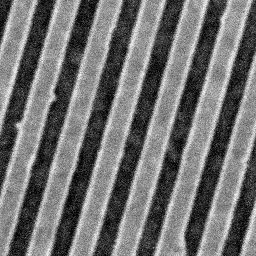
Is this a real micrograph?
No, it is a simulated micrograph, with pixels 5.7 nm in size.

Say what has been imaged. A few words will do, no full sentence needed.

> parallel lines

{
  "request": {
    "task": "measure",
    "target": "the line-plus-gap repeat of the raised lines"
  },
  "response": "235 nanometres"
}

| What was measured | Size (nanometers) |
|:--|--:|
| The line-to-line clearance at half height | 117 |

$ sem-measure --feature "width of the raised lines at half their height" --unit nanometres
117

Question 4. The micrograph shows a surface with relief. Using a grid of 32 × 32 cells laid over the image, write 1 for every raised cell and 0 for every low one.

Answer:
00110001110011100011000111000110
01110001100011100011000110001110
01110001100011000111000110001110
01110011100011000111001110001100
01100011100111000110001110011100
11100011000111001110001100011100
11100111000110001110011100011000
11000111001110001100011100111000
11000110001110001100011100111000
11000110001100011100011000111001
11001110001100011100111000110001
10001110011100011000111001110001
10001110011100111000110001110011
10011100011000111001110001100011
00011100111000110001110011100011
00011000111000110001110011100011
00111000110001110001100011100111
00111000110001110011100011000111
00111001110001100011100111000110
00110001110011100011000111001110
01110001100011100111000110001110
01110011100011000111001110001100
01100011100011000111001110001100
11100011000111000110001110011100
11100011000111001110001100011100
11100111000110001110011100011000
11000111001110001100011100111000
11000110001110011100011000111000
11001110001100011100111000111001
10001110011100011000111001110001
10001100011100011000111001110001
10001100011000111000111001110011